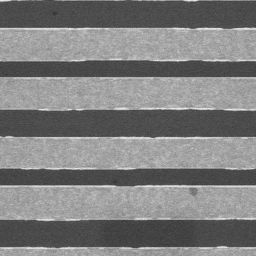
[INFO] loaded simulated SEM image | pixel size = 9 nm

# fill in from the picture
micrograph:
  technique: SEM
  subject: lines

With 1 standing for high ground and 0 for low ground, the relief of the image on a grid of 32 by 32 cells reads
00000000000000000000000000000000
00000000000000000000000000000000
00000000000000000000000000000000
00000000000000000000000000000000
11111111111111111111111111111111
11111111111111111111111111111111
11111111111111111111111111111111
11111111110000000001111001111111
00000000000000000000000000000000
00000000000000000000000000000000
11111111111111111111111111111111
11111111111111111111111111111111
11111111111111111111111111111111
11111111111111111111111001111111
00000000000000000000000000000000
00000000000000000000000000000000
00000000000000000000000000000000
11111111111111111111111111111111
11111111111111111111111111111111
11111111111111111111111111111111
11111111111111111111111111111111
00000000000000000000000000000000
00000000000000000000000000000000
11111111111111111111111111111111
11111111111111111111111111111111
11111111111111111111111111111111
11111111111111111111111111111111
00000000000000000000000000000000
00000000000000000000000000000000
00000000000000000000000000000000
00000000000000000000000000000000
11111111111111111111111111111111